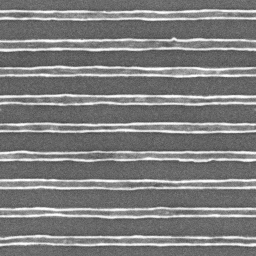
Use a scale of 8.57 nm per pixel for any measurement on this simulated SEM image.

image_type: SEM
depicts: parallel lines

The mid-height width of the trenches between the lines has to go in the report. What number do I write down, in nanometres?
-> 175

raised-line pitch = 242 nanometres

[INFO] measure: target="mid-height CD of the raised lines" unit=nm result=66.5